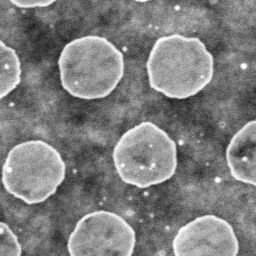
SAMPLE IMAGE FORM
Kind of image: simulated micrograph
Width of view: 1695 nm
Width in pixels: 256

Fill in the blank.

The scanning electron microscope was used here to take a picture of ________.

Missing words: raised bodies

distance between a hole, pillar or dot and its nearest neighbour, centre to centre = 0.612 microns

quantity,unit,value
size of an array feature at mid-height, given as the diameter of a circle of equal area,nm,413